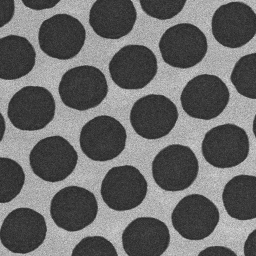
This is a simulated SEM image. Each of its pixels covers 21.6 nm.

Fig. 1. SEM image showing a regular array of holes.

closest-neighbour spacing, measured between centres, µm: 1.16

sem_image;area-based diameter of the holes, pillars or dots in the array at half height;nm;1000